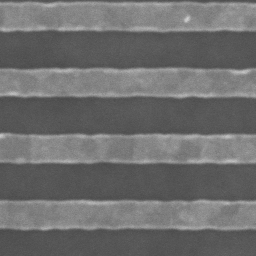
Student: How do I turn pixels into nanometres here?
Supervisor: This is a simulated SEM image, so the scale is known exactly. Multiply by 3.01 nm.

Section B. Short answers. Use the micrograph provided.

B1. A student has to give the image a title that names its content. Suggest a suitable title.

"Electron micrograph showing wiring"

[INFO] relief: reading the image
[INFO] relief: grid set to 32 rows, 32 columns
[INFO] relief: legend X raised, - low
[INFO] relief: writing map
XXXXXXXXXXXXXXXXXXXXXXXXXXXXXXXX
XXXXXXXXXXXXXXXXXXXXXXXXXXXXXXXX
XXXXXXXXXXXXXXXXXXXXXXXXXXXXXXXX
XXXXXXXXXXXXXXXXXXXXXXXXXXXXXXXX
--------------------------------
--------------------------------
--------------------------------
--------------------------------
--------------------------------
XXXXXXXXXXXXXXXXXXXXXXXXXXXXXXXX
XXXXXXXXXXXXXXXXXXXXXXXXXXXXXXXX
XXXXXXXXXXXXXXXXXXXXXXXXXXXXXXXX
--------------------------------
--------------------------------
--------------------------------
--------------------------------
--------------------------------
XXXXXXXXXXXXXXXXXXXXXXXXXXXXXXXX
XXXXXXXXXXXXXXXXXXXXXXXXXXXXXXXX
XXXXXXXXXXXXXXXXXXXXXXXXXXXXXXXX
--------------------------------
--------------------------------
--------------------------------
--------------------------------
--------------------------------
XXXXXXXXXXXXXXXXXXXXXXXXXXXXXXXX
XXXXXXXXXXXXXXXXXXXXXXXXXXXXXXXX
XXXXXXXXXXXXXXXXXXXXXXXXXXXXXXXX
-XXXXXXXX-XX-XX-------XXXXXXXXXX
--------------------------------
--------------------------------
--------------------------------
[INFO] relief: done